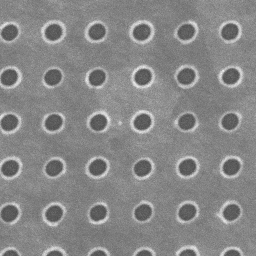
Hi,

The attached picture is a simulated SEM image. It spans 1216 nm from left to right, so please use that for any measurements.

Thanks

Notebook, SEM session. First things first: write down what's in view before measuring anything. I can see a regular array of holes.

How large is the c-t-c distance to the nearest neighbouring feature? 208 nanometers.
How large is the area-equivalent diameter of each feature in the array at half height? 0.0868 µm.